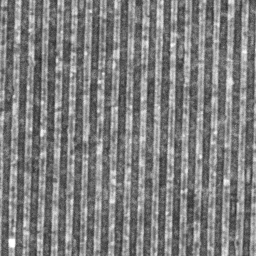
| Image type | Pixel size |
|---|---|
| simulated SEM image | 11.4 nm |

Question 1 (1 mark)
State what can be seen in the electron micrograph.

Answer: parallel lines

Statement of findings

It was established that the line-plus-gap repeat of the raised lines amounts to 0.162 um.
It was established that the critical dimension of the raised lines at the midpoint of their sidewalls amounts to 55.6 nm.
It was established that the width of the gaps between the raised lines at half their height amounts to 113 nm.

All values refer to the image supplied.